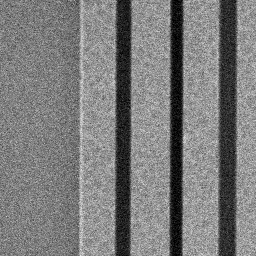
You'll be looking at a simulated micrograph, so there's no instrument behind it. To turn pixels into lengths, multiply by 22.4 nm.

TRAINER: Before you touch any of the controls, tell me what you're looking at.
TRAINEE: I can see parallel lines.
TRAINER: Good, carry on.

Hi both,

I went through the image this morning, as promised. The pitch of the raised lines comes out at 1140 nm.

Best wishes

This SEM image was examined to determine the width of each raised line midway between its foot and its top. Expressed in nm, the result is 810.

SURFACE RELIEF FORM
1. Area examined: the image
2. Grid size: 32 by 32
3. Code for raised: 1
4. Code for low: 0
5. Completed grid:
00000000001111001111100111100011
00000000001111001111100111100011
00000000001111001111100111100011
00000000001111001111100111100011
00000000001111001111100111100011
00000000001111001111100111100011
00000000001111001111100111100011
00000000001111001111100111100011
00000000001111001111100111100011
00000000001111001111100111100011
00000000001111001111100111100011
00000000001111001111100111100011
00000000001111001111100111100011
00000000001111001111100111100011
00000000001111001111100111100011
00000000001111001111100111100011
00000000001111001111100111100011
00000000001111001111100111100011
00000000001111001111100111100011
00000000001111001111100111100011
00000000001111001111100111100011
00000000001111001111100111100011
00000000001111001111100111100011
00000000001111001111100111100011
00000000001111001111100111100011
00000000001111001111100111100011
00000000001111001111100111100011
00000000001111001111100111100011
00000000001111001111100111100011
00000000001111001111100111100011
00000000001111001111100111100011
00000000001111001111100111100011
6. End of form